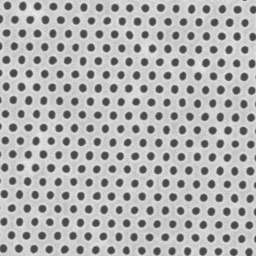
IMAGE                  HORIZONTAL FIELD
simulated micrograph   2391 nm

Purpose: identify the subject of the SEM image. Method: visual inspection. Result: a regular array of holes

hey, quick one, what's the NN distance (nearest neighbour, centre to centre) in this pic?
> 141 nm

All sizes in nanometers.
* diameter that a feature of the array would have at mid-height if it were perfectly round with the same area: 77.5